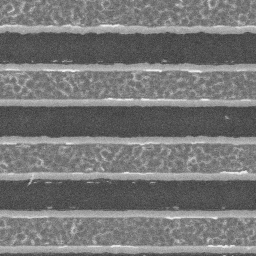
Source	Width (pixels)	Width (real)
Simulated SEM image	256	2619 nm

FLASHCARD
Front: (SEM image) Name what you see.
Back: one or a few lines or trenches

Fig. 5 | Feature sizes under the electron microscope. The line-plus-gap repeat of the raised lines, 750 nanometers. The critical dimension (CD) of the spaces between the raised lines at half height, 366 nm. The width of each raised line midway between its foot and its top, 384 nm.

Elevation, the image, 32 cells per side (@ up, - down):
@@@@@@@@@@@@@@@@@@@@@@@@@@@@@@@@
@@@@@@@@@@@@@@@@@@@@@@@@@@@@@@@@
@@@@@@@@@@@@@@@@@@@@@@@@@@@@@@@@
@@@@@@@@@@@@@@@@@@@@@@@@@@@@@@@@
--------------------------------
--------------------------------
--------------------------------
--------------------------------
@@@@@@@@@@@@@@@@@@@@@@@@@--@-@@@
@@@@@@@@@@@@@@@@@@@@@@@@@@@@@@@@
@@@@@@@@@@@@@@@@@@@@@@@@@@@@@@@@
@@@@@@@@@@@@@@@@@@@@@@@@@@@@@@@@
@@@@@@@@@@@@@@@@@@@@@@@@@@@@@@@@
--------------------------------
--------------------------------
--------------------------------
--------------------------------
-@@@-@@-@-@@@----@@@@-@@@@@@@-@-
@@@@@@@@@@@@@@@@@@@@@@@@@@@@@@@@
@@@@@@@@@@@@@@@@@@@@@@@@@@@@@@@@
@@@@@@@@@@@@@@@@@@@@@@@@@@@@@@@@
@@@@@@@@@@@@@@@@@@@@@@@@@@@@@@@@
--------------------------------
--------------------------------
--------------------------------
--------------------------------
--------------------------------
@@@@@@@@@@@@@@@@@@@@@@@@@@@@@@@@
@@@@@@@@@@@@@@@@@@@@@@@@@@@@@@@@
@@@@@@@@@@@@@@@@@@@@@@@@@@@@@@@@
@@@@@@@@@@@@@@@@@@@@@@@@@@@@@@@@
--------------------------------